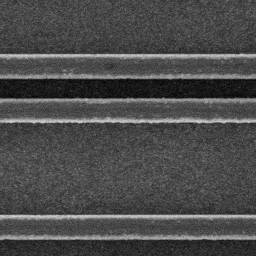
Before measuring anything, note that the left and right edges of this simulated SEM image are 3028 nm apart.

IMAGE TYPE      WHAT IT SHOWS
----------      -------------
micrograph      lines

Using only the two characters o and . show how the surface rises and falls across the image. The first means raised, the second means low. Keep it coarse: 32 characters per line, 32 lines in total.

................................
................................
................................
................................
................................
................................
................................
oooooooooooooooooooooooooooooooo
oooooooooooooooooooooooooooooooo
oooooooooooooooooooooooooooooooo
................................
................................
oooooooooooooooooooooooooooooooo
oooooooooooooooooooooooooooooooo
oooooooooooooooooooooooooooooooo
................................
................................
................................
................................
................................
................................
................................
................................
................................
................................
................................
................................
oooooooooooooooooooooooooooooooo
oooooooooooooooooooooooooooooooo
oooooooooooooooooooooooooooooooo
................................
................................